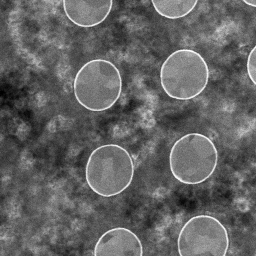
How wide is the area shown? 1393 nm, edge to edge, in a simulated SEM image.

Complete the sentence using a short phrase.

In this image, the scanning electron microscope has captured raised bodies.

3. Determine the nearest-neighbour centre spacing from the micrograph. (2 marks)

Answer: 0.46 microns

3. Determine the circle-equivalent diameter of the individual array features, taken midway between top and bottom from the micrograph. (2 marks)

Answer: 0.264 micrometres